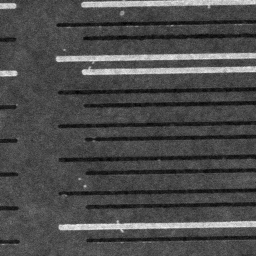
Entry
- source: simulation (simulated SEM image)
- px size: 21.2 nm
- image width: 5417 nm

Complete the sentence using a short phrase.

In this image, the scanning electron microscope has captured parallel lines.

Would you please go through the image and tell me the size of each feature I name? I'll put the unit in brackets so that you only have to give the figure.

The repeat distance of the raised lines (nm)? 354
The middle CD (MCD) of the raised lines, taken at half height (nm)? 100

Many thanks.